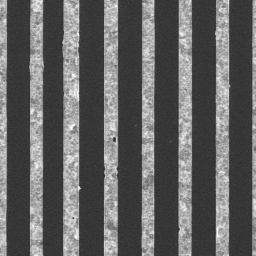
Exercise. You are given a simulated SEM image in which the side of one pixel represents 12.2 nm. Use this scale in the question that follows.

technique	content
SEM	parallel lines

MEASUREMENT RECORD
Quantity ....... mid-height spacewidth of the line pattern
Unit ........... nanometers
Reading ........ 301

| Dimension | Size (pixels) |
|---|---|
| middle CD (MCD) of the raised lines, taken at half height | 12.1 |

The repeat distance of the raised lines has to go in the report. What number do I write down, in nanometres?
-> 454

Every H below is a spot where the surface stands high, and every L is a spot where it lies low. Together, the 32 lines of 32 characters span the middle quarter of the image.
HHHHLLLLLLHHHLLLLLLLHHLLLLLLLHHH
HHHHLLLLLLHHHLLLLLLLHHLLLLLLLHHH
HHHHLLLLLLHHHLLLLLLLHHLLLLLLLHHH
HHHHLLLLLLHHHLLLLLLLHHLLLLLLLHHH
HHHHLLLLLLHHHLLLLLLLHHLLLLLLLHHH
HHHHLLLLLLHHHLLLLLLLHHLLLLLLLHHH
HHHHLLLLLLHHHLLLLLLLHHLLLLLLLHHH
HHHLLLLLLLHHHLLLLLLLHHLLLLLLLHHH
HHHHLLLLLLHHHLLLLLLLHHLLLLLLLHHH
HHHHLLLLLLHHHLLLLLLLHHLLLLLLLHHH
HHHHLLLLLLHHHLLLLLLLHHLLLLLLLHHH
HHHHLLLLLLHHHLLLLLLLHHLLLLLLLHHH
HHHHLLLLLLLHHLLLLLLLHHLLLLLLLHHH
HHHHLLLLLLHHHLLLLLLLHHLLLLLLLHHH
HHHHLLLLLLHHHLLLLLLLHHLLLLLLLHHH
HHHHLLLLLLHHHLLLLLLLHHLLLLLLLHHH
HLHHLLLLLLHHHLLLLLLLHHLLLLLLLHHH
HHHHLLLLLLHHHLLLLLLLHHLLLLLLLHHH
HHHHLLLLLLHHLLLLLLLLHHLLLLLLLHHH
HHHHLLLLLLHHLLLLLLLLHHLLLLLLLHHH
HHHHLLLLLLHHHLLLLLLLHHLLLLLLLHHH
HHHHLLLLLLHHHLLLLLLLHHLLLLLLLHHH
HHHHLLLLLLHHHLLLLLLLHHLLLLLLLHHH
HHHHLLLLLLHHHLLLLLLLHHLLLLLLLHHH
HHHHLLLLLLHHHLLLLLLLHHLLLLLLLHHH
HHHLLLLLLLHHHLLLLLLLHHLLLLLLLHHH
HHHLLLLLLLHHHLLLLLLLHHLLLLLLLHHH
HHHLLLLLLLHHHLLLLLLLHHLLLLLLLHHH
HHHLLLLLLLHHHLLLLLLLHHLLLLLLLHHH
HHHLLLLLLLHHHLLLLLLLHHLLLLLLLHHH
HHHHLLLLLLHHHLLLLLLLHHLLLLLLLHHH
HHHHLLLLLLHHHLLLLLLLHHLLLLLLLHHH